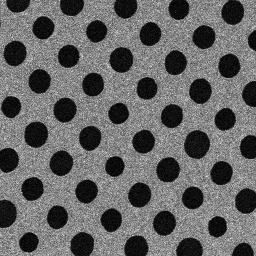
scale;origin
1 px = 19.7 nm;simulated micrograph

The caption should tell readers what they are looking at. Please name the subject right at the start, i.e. a regular array of holes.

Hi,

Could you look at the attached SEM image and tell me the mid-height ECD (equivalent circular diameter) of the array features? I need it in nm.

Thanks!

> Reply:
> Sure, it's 458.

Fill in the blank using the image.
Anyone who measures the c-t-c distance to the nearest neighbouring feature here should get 0.741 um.